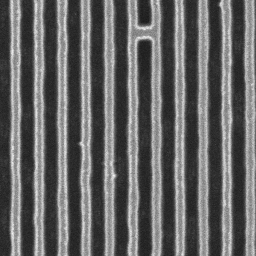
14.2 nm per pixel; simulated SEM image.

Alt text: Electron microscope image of parallel lines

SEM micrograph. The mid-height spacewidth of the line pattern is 0.184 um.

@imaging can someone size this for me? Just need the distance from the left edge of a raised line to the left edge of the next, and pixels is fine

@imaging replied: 23.5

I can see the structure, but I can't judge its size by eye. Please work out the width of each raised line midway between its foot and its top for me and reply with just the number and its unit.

142 nm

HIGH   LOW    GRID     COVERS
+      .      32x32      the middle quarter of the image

+...++....+++...++....++....++..
+...+++...+++...++....++....++..
+...+++...+++...++....++....++..
+...+++...++....++....++....++..
+...+++...+++...++....++....++..
+...+++...+++...++....++....++..
+...+++...++....++....++....++..
+...+++...++....++....++....++..
+...+++...++....+++...++....++..
+...+++...++....+++...++....++..
+...+++...++....+++...++....++..
+...+++...++....++....++....++..
+...+++...++....++....++....++..
+...+++...++....++....++....++..
+...+++...++....++....++....++..
+...+++...+++...++....++....++..
+...+++...+++...++....++....++..
+...+++...++....++....++....++..
+...+++...++....++....++....++..
+...+++...++....++....++....++..
+...+++...++....++....++....++..
+...+++...++....++....++....++..
+...+++...++....++....++....++..
+...+++...++....++....++....++..
+...+++...++....++....++....++..
+...+++...++....++....++...+++..
+...+++...++....++....++...+++..
+...+++...+++...++....++....++..
+...++....+++...++....++...+++..
+...++....+++...++....++....++..
+...+++...+++...++....++....++..
+...+++...+++...+++...++....++..